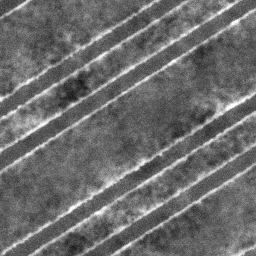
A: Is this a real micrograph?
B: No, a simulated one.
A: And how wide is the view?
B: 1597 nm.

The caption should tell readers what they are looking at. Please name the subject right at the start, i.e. lines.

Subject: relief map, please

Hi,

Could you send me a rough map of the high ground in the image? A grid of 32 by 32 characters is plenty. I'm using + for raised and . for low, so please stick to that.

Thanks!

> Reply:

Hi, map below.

...++++++++++++++++....++++++...
.+++++++++++++++++...+++++++...+
++++++++++++++++....++++++....++
++++++++++++++....+++++++...++++
+++++++++++++...+++++++....+++++
+++++++++++....++++++....+++++++
++++++++++...+++++++...+++++++++
++++++++....++++++....++++++++++
++++++....+++++++...++++++++++++
+++++....++++++....+++++++++++++
+++....+++++++...+++++++++++++++
++...+++++++....++++++++++++++++
....++++++....+++++++++++++++++.
..+++++++...+++++++++++++++++...
.++++++....++++++++++++++++....+
++++++...+++++++++++++++++....++
++++....++++++++++++++++....++++
++....+++++++++++++++++...++++++
+....++++++++++++++++....++++++.
...+++++++++++++++++...+++++++..
.+++++++++++++++++....++++++....
++++++++++++++++....+++++++...++
+++++++++++++++...+++++++....+++
+++++++++++++....++++++....+++++
++++++++++++...+++++++....++++++
++++++++++....++++++....++++++++
+++++++++...+++++++...++++++++++
+++++++....++++++....+++++++++++
+++++....+++++++...+++++++++++++
++++....++++++....++++++++++++++
++....++++++....++++++++++++++++
+...+++++++....++++++++++++++++.